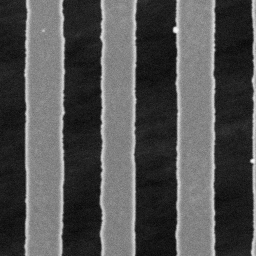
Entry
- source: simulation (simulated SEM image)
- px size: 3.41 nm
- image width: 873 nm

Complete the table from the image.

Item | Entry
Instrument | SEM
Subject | lines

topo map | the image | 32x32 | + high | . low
...+++++.....++++.....+++++.....
...+++++.....++++.....+++++.....
...+++++.....++++.....+++++.....
...+++++.....++++.....+++++.....
...+++++.....++++.....+++++.....
...+++++.....++++.....+++++.....
...+++++.....++++.....+++++.....
...+++++.....++++.....+++++.....
...+++++.....++++.....+++++.....
...+++++.....++++.....+++++.....
...+++++.....++++.....+++++.....
...+++++.....++++.....+++++.....
...+++++.....++++.....+++++.....
...+++++.....++++.....+++++.....
...+++++.....++++.....+++++.....
...+++++.....++++.....+++++.....
...+++++.....++++.....+++++.....
...+++++.....++++.....+++++.....
...+++++.....++++.....+++++.....
...+++++.....++++.....+++++.....
...+++++.....++++.....+++++.....
...+++++.....++++.....+++++.....
...+++++.....++++.....+++++.....
...+++++.....++++.....+++++.....
...+++++.....++++.....+++++.....
...+++++.....++++.....+++++.....
...+++++.....++++.....+++++.....
...+++++.....++++.....+++++.....
...+++++.....++++.....+++++.....
...+++++.....++++.....+++++.....
...+++++.....++++.....+++++.....
...+++++.....++++.....+++++....+